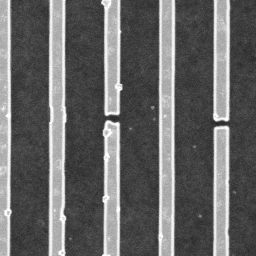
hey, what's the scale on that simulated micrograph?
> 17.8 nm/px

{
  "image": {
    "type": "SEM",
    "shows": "parallel lines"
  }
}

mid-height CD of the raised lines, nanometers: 238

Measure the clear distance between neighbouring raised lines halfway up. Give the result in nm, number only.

726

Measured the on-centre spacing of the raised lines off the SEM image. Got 54.7 pixels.